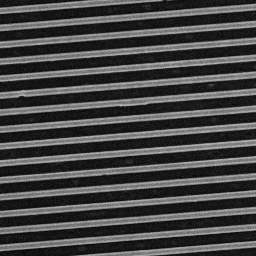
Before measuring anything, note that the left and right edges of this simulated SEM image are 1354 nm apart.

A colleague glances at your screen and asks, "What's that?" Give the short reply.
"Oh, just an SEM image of parallel lines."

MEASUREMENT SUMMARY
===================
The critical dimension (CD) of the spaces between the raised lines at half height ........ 60.6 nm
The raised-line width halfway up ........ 28.3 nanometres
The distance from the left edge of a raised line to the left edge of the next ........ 89.4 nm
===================